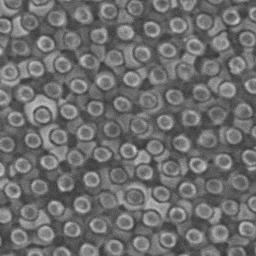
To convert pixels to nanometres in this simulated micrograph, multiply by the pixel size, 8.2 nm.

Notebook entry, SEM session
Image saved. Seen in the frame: a regular array of raised bodies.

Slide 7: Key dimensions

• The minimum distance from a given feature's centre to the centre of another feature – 120 nm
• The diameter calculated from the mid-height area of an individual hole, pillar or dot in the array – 120 nanometers